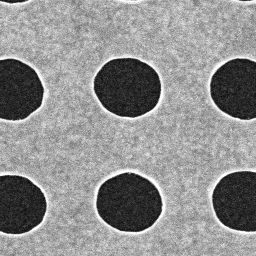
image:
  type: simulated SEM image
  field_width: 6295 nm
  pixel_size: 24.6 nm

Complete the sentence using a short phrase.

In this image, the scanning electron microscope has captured holes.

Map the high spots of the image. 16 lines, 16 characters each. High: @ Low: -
@@@@@@@@@@@@@@@@
@@@@@@@@@@@@@@@@
@@@@@@@@@@@@@@@@
@@@@@@@@@@@@@@@@
--@@@@----@@@---
---@@@----@@@---
---@@@----@@@---
@@@@@@@@@@@@@@@@
@@@@@@@@@@@@@@@@
@@@@@@@@@@@@@@@@
@@@@@@@@@@@@@@@@
--@@@@----@@@@--
---@@@----@@@---
---@@@----@@@@--
--@@@@@@@@@@@@@@
@@@@@@@@@@@@@@@@